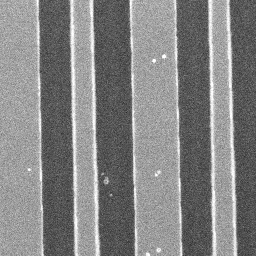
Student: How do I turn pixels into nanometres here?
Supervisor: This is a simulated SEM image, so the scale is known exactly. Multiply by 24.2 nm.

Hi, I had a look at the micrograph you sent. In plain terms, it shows lines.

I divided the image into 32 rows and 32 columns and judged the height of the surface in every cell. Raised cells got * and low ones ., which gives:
*****....**.....******....**....
*****....**.....******....**....
*****....**.....******....**....
*****....**.....******....***...
*****....**.....******....***...
*****....***....******....***...
*****....***.....*****....***...
*****....***.....*****.....**...
*****....***.....*****....***...
*****....***.....*****.....**...
*****....***.....*****.....**...
*****....***.....*****.....**...
*****....***.....*****.....**...
*****....***.....*****.....**...
*****....***.....*****.....**...
*****....***.....*****.....**...
*****....***.....*****.....**...
*****....***.....*****.....**...
*****....***.....*****.....**...
*****....***.....*****.....**...
*****....***.....*****.....**...
*****....***.....*****.....**...
*****....***.....*****.....**...
*****.....**.....*****.....**...
*****.....**.....*****.....**...
*****.....**.....*****.....**...
*****.....**.....******....**...
*****.....**.....******....**...
*****.....**.....******....**...
*****.....**.....******....**...
*****.....**.....******....**...
*****.....**.....******....**...